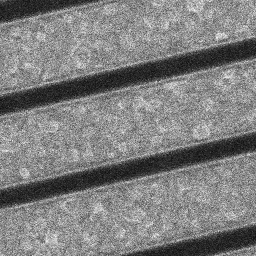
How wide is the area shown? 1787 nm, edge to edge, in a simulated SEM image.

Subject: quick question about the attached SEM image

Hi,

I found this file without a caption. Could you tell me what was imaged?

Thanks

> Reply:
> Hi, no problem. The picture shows one or a few lines or trenches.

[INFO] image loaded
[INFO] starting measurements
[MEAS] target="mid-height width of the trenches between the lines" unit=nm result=470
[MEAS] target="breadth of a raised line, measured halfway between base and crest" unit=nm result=168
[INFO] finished